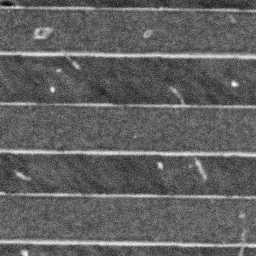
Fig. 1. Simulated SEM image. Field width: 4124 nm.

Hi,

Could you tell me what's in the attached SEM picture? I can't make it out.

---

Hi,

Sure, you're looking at lines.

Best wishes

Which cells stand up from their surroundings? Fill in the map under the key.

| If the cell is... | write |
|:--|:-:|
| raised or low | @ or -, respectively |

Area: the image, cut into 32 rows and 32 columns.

--------------------------------
@@@@@@@@@@@@@@@@@@@@@@@@@@@@@@@@
@@@@@@@@@@@@@@@@@@@@@@@@@@@@@@@@
@@@@@@@@@@@@@@@@@@@@@@@@@@@@@@@@
@@@@@@@@@@@@@@@@@@@@@@@@@@@@@@@@
@@@@@@@@@@@@@@@@@@@@@@@@@@@@@@@@
@@@@@@@@@@@@@@@@@@@@@@@@@@@@@@@@
--------------------------------
--------------------------------
--------------------------------
--------------------------------
--------------------------------
--------------------------------
@@@@@@@@@@@@@@@@@@@@@@@@@@@@@@@@
@@@@@@@@@@@@@@@@@@@@@@@@@@@@@@@@
@@@@@@@@@@@@@@@@@@@@@@@@@@@@@@@@
@@@@@@@@@@@@@@@@@@@@@@@@@@@@@@@@
@@@@@@@@@@@@@@@@@@@@@@@@@@@@@@@@
@@@@@@@@@@@@@@@@@@@@@@@@@@@@@@@@
--------------------------------
--------------------------------
--------------------------------
--------------------------------
--------------------------------
@@@@@@@@@@@@@@@@@@@@------------
@@@@@@@@@@@@@@@@@@@@@@@@@@@@@@@@
@@@@@@@@@@@@@@@@@@@@@@@@@@@@@@@@
@@@@@@@@@@@@@@@@@@@@@@@@@@@@@@@@
@@@@@@@@@@@@@@@@@@@@@@@@@@@@@@@@
@@@@@@@@@@@@@@@@@@@@@@@@@@@@@@@@
------------------@@@@@@@@@@@@@@
--------------------------------